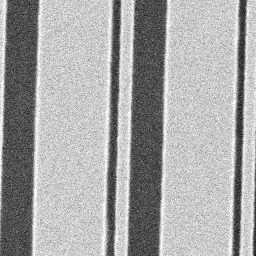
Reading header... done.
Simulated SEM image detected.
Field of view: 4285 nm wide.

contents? lines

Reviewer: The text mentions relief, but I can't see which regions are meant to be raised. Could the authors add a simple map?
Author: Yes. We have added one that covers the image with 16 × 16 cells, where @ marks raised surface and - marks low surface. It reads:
--@@@@@@---@@@@@
--@@@@@@--@@@@@@
--@@@@@@--@@@@@@
--@@@@@@--@@@@@@
--@@@@@@--@@@@@@
--@@@@@@--@@@@@@
--@@@@@@--@@@@@@
--@@@@@@--@@@@@@
--@@@@@@--@@@@@@
--@@@@@@--@@@@@@
--@@@@@@--@@@@@@
--@@@@@@--@@@@@@
--@@@@@@--@@@@@@
--@@@@@@--@@@@@@
--@@@@@@--@@@@@@
--@@@@@@--@@@@@@